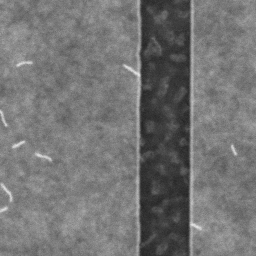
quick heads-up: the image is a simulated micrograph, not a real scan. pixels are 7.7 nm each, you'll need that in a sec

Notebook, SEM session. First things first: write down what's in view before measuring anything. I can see one or a few lines or trenches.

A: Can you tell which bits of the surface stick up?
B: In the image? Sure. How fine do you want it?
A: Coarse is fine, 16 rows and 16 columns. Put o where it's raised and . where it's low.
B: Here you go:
ooooooooo...oooo
ooooooooo...oooo
ooooooooo...oooo
ooooooooo...oooo
ooooooooo...oooo
ooooooooo...oooo
ooooooooo...oooo
ooooooooo...oooo
ooooooooo...oooo
ooooooooo...oooo
ooooooooo...oooo
ooooooooo...oooo
ooooooooo...oooo
ooooooooo...oooo
ooooooooo...oooo
ooooooooo...oooo